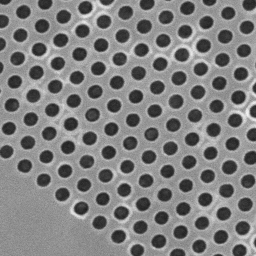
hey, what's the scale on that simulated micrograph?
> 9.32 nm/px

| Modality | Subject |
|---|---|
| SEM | a regular array of holes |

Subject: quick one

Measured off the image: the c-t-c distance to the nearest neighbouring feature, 23.3 px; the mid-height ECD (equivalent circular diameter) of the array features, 138 nanometres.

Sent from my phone